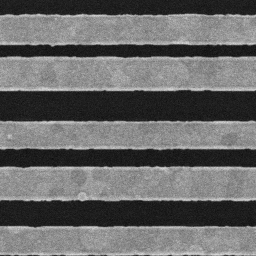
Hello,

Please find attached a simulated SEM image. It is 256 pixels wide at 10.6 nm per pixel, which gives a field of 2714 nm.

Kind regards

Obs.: lines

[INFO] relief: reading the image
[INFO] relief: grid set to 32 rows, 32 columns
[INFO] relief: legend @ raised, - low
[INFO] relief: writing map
--------------------------------
--------------------------------
@@@@@@@@@@@@@@@@@@@@@@@@@@@@@@@@
@@@@@@@@@@@@@@@@@@@@@@@@@@@@@@@@
@@@@@@@@@@@@@@@@@@@@@@@@@@@@@@@@
------@-------------------------
--------------------------------
@@@@@@@@@@@@@@@@@@@@@@@@@@@@@@@@
@@@@@@@@@@@@@@@@@@@@@@@@@@@@@@@@
@@@@@@@@@@@@@@@@@@@@@@@@@@@@@@@@
@@@@@@@@@@@@@@@@@@@@@@@@@@@@@@@@
--------------------------------
--------------------------------
--------------------------------
--------------------------------
@@@@@@@@@@@@@@@@@@@@@@@@@@@@@@@@
@@@@@@@@@@@@@@@@@@@@@@@@@@@@@@@@
@@@@@@@@@@@@@@@@@@@@@@@@@@@@@@@@
@@@@@@@@@@@@@@@@@@@@@@@@@@@@@@@@
--------------------------------
--------------------------------
@@@@@@@@@@@@@@@@@@@@@@@@@@@@@@@@
@@@@@@@@@@@@@@@@@@@@@@@@@@@@@@@@
@@@@@@@@@@@@@@@@@@@@@@@@@@@@@@@@
@@@@@@@@@@@@@@@@@@@@@@@@@@@@@@@@
--------------------------------
--------------------------------
--------------------------------
@@@@@@@@@@@@@@@@@@@@@@@@@@@@@@@@
@@@@@@@@@@@@@@@@@@@@@@@@@@@@@@@@
@@@@@@@@@@@@@@@@@@@@@@@@@@@@@@@@
@@@@@@@@@@@@@@@@@@@@@@@@@@@@@@@@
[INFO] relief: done